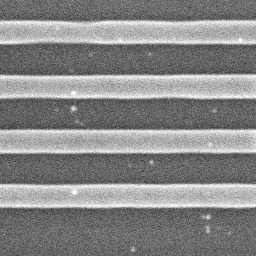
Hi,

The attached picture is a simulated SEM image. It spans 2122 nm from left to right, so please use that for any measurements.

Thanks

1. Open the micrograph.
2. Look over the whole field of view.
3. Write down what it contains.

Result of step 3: groups of lines, slits or small figures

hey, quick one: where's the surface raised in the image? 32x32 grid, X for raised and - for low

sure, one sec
--------------------------------
--------------------------------
--------------------------------
XXXXXXXXXXXXXXXXXXXXXXXXXXXXXXXX
XXXXXXXXXXXXXXXXXXXXXXXXXXXXXXXX
--------------------------------
--------------------------------
--------------------------------
--------------------------------
-----------------------------XX-
XXXXXXXXXXXXXXXXXXXXXXXXXXXXXXXX
XXXXXXXXXXXXXXXXXXXXXXXXXXXXXXXX
--------------------------------
--------------------------------
--------------------------------
--------------------------------
XXXXXXXXXXXXXXXXXXXXXXXXXXXXXXXX
XXXXXXXXXXXXXXXXXXXXXXXXXXXXXXXX
XXXXXXXXXXXXXXXXXXXXXXXXXXXXXXXX
--------------------------------
--------------------------------
--------------------------------
--------------------------------
XXXXXXXXXXXXXXXXXXXXXXXXXXXXXXXX
XXXXXXXXXXXXXXXXXXXXXXXXXXXXXXXX
XXXXXXXXXXXXXXXXXXXXXXXXXXXXXXXX
--------------------------------
--------------------------------
--------------------------------
--------------------------------
--------------------------------
--------------------------------